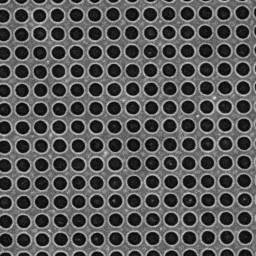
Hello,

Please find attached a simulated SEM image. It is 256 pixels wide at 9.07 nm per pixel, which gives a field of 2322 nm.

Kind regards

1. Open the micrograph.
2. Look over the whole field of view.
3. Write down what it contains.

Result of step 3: a regular array of holes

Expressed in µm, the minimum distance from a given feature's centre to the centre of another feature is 0.166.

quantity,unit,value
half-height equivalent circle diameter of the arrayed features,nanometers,126